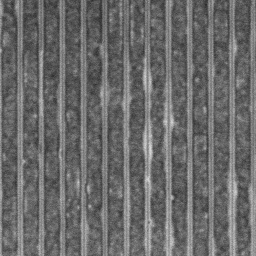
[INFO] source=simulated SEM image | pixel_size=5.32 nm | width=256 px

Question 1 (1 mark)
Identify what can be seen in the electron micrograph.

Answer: parallel lines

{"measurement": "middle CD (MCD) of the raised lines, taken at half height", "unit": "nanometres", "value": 20.6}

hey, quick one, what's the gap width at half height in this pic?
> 0.0937 microns